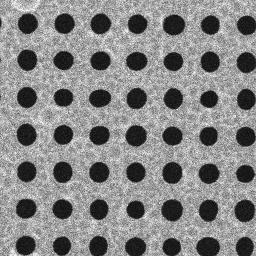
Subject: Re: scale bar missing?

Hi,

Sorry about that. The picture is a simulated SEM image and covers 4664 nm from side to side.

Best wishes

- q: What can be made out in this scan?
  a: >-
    a regular array of holes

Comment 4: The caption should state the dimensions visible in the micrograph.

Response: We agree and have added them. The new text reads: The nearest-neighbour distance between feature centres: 662 nanometers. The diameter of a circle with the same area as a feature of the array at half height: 373 nm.